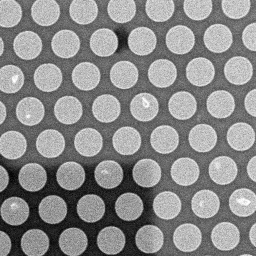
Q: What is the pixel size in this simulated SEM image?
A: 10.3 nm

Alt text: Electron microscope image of an array of small figures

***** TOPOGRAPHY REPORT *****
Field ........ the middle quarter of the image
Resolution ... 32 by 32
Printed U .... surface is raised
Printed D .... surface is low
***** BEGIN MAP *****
DDDUUUUUDDDDUUUUUUDDDDUUUUUUDDDU
DDUUUUUUUDDDUUUUUUDDDUUUUUUUDDDU
DDUUUUUUUDDDUUUUUUDDDUUUUUUUDDDU
DDUUUUUUUDDDUUUUUUDDDUUUUUUUDDDU
DDUUUUUUUDDDUUUUUUDDDDUUUUUDDDDD
DDDUUUUUDDDDDUUUUDDDDDDUUUDDDDDD
DDDDDDDDDDDDDDDDDDDDDDDDDDDDDDDD
DDDDDDDDDDDDDDDDDDDUUDDDDDDDUUUU
UUUDDDDDUUUUUDDDDUUUUUUDDDDUUUUU
UUUUDDDDUUUUUUDDDUUUUUUDDDUUUUUU
UUUUDDDUUUUUUUDDDUUUUUUDDDUUUUUU
UUUUDDDUUUUUUUDDDUUUUUUDDDUUUUUU
UUUUDDDUUUUUUUDDDUUUUUUDDDDUUUUU
UUUUDDDDUUUUUDDDDDUUUUDDDDDDUUUD
UUUDDDDDDDUDDDDDDDDDDDDDDDDDDDDD
DDDDDDDDDDDDDDDDDDDDDDDDUUDDDDDD
DDDDDUUUDDDDDDUUUUDDDDDUUUUUDDDD
DDDUUUUUUDDDDUUUUUUDDDUUUUUUDDDU
DDDUUUUUUDDDUUUUUUUDDDUUUUUUDDDU
DDDUUUUUUDDDUUUUUUUDDDUUUUUUUDDU
DDDUUUUUUDDDUUUUUUUDDDUUUUUUDDDD
DDDUUUUUUDDDDUUUUUDDDDDUUUUDDDDD
DDDDUUUUDDDDDDDUUDDDDDDDDDDDDDDD
DDDDDDDDDDDDDDDDDDDDDDDDDDDDDDDD
DDDDDDDDDDUUUDDDDDDUUUUDDDDDUUUU
UUUUDDDDUUUUUUDDDDUUUUUUDDDUUUUU
UUUUUDDDUUUUUUDDDUUUUUUUDDDUUUUU
UUUUUDDDUUUUUUUDDUUUUUUUDDDUUUUU
UUUUUDDDUUUUUUUDDUUUUUUUDDDUUUUU
UUUUUDDDUUUUUUDDDDUUUUUDDDDDUUUU
UUUUDDDDDUUUUDDDDDDUUUDDDDDDDDDD
DDDDDDDDDDDDDDDDDDDDDDDDDDDDDDDD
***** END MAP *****